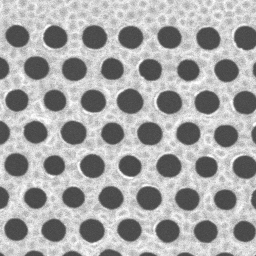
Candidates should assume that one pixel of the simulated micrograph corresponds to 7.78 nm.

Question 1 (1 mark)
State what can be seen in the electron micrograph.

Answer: a regular array of holes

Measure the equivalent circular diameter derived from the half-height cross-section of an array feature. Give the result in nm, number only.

184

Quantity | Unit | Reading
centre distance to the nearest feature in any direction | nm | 288